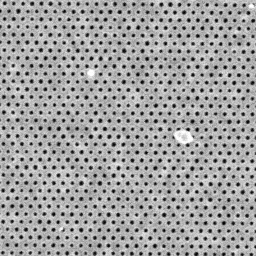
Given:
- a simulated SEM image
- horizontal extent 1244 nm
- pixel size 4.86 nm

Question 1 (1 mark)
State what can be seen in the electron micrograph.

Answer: a regular array of holes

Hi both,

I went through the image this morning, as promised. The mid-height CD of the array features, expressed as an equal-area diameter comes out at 21.3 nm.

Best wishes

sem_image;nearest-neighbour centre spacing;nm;43